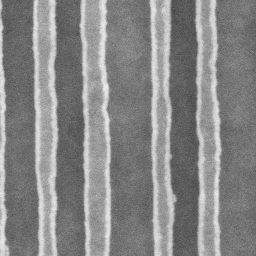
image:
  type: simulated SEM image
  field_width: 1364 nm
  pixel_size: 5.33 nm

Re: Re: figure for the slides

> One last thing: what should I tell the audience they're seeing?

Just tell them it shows lines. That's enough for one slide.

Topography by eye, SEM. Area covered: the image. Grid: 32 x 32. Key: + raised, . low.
....+++...+++......++....++.....
....+++...+++......++....++.....
....+++...+++......++....++.....
....+++...+++......++....++.....
....+++...+++......++....++.....
....+++...+++......++....++.....
....+++...+++......++....++.....
....+++...+++......++....++.....
....+++...+++......++....++.....
....+++...+++......++....++.....
+...+++...+++......++....++.....
+...+++...++++.....++....++.....
+...+++...++++.....++....++.....
+...+++...+++......++....++.....
+....++...++++.....++....++.....
+....++....+++.....++....++.....
+....++....+++.....++....++.....
+....++....+++.....++....++.....
+....++....+++.....++....+++....
.....++...++++.....++....++.....
.....++....+++.....++....++.....
+....++....+++.....++....++.....
+....++....+++.....++....++.....
.....++....+++.....++....++.....
.....++....+++.....+++...++.....
+....++....+++.....+++...++.....
+....++....+++.....+++...++.....
+....++....+++.....+++...++.....
+....++....+++.....+++...++.....
+....++....+++.....+++...++.....
+....++....+++.....+++...++.....
+....++....+++.....+++...++.....